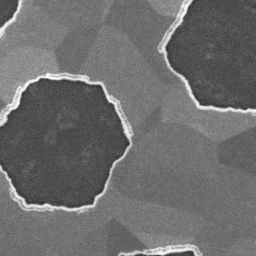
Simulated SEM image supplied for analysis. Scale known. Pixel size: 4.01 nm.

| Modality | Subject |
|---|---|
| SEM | holes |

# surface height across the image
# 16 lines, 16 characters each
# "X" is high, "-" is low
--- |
-XXXXXXXXXXX----
XXXXXXXXXXX-----
XXXXXXXXXX------
XXXXXXXXXX------
XXXXXXXXXXX-----
XX----XXXXXX----
X------XXXXX----
--------XXXXXXXX
--------XXXXXXXX
--------XXXXXXXX
-------XXXXXXXXX
X------XXXXXXXXX
X-----XXXXXXXXXX
XXXXXXXXXXXXXXXX
XXXXXXXXXXXXXXXX
XXXXXXXXXXXXXXXX